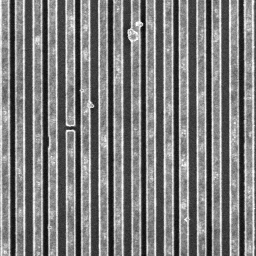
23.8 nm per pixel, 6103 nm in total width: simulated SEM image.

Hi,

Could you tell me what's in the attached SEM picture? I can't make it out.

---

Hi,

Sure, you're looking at parallel lines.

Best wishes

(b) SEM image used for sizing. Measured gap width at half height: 0.161 microns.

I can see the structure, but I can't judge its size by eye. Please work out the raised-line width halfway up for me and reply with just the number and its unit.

203 nanometres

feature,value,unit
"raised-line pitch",389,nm